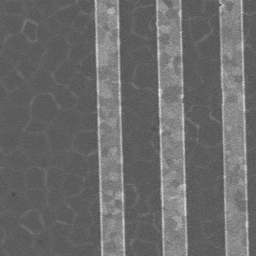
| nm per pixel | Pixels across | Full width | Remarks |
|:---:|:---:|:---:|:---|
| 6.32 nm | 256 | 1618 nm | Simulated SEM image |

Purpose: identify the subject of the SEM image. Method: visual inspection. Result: one or a few lines or trenches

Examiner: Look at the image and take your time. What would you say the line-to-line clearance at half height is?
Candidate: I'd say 253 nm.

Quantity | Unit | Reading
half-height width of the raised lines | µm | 0.141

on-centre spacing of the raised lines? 62 pixels